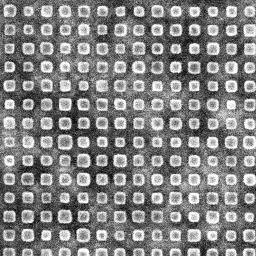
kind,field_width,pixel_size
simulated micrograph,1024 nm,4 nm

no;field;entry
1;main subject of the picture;a regular array of raised bodies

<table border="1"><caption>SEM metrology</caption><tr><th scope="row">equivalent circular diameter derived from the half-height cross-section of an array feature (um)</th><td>0.0444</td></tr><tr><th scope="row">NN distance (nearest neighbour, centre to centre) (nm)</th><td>73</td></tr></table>